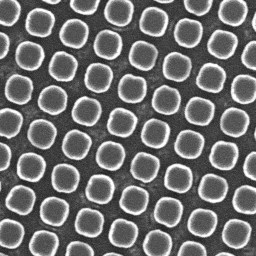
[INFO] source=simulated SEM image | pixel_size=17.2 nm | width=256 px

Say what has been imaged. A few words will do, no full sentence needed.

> a regular array of raised bodies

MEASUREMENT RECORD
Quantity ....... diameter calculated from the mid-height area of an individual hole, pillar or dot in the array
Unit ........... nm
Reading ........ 487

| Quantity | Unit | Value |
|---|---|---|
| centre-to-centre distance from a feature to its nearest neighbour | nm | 601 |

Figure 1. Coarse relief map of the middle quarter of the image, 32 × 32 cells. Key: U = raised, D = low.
UUUDDDDUUUUDDDDDDDUUUUDDDUUUUUUU
UUUDDDUUUUUUDDDDDDDDUDDDDUUUUUUU
UUUDDDUUUUUUDDDDDDDDDDDDDUUUUUUD
UUDDDUUUUUUUDDDUUUUDDDDDDDUUUUDD
DDDDDUUUUUUUDDUUUUUUDDDDDDDDDDDD
DDDDDDUUUUUDDDUUUUUUDDDDDUDDDDDD
DDDDDDDUUUUDDDUUUUUUDDDUUUUUDDDD
DDDDDDDDDDDDDDUUUUUUDDDUUUUUUDDD
UDDDUUDDDDDDDDUUUUUUDDUUUUUUUDDD
UDDUUUUUDDDDDDDDUUDDDDUUUUUUUDDU
DDDUUUUUUDDDDDDDDDDDDDUUUUUUUDDU
DDUUUUUUUDDDDUUDDDDDDDDUUUUUDDUU
DDUUUUUUUDDDUUUUUDDDDDDDDUUDDDUU
DDUUUUUUDDDUUUUUUUDDDDDDDDDDDDDU
DDDUUUUUDDDUUUUUUUDDDUUUUDDDDDDD
DDDDDDDDDDDUUUUUUUDDUUUUUUDDDDDD
DDDDDDDDDDDUUUUUUDDDUUUUUUDDDDDD
DUUUUDDDDDDDUUUUDDDUUUUUUUDDDUUU
UUUUUUDDDDDDDDDDDDDUUUUUUUDDUUUU
UUUUUUUDDDDUDDDDDDDDUUUUUUDDUUUU
UUUUUUDDDUUUUUDDDDDDDUUUUDDDUUUU
UUUUUUDDDUUUUUUDDDDDDDDDDDDDUUUU
UUUUUDDDUUUUUUUDDDDUUDDDDDDDDUUU
DDUUUDDDUUUUUUUDDDUUUUUDDDDDDDDU
DDDDDDDDUUUUUUUDDUUUUUUUDDDDDDDD
UUDDDDDDDUUUUUDDDUUUUUUUDDDUUUDD
UUUDDDDDDDDDDDDDDUUUUUUDDDUUUUUD
UUUUDDDDDDDDDDDDDUUUUUUDDUUUUUUU
UUUUDDDUUUUDDDDDDDUUUUDDDUUUUUUU
UUUUDDUUUUUUDDDDDDDDUDDDDUUUUUUU
UUUDDDUUUUUUDDDDDDDDDDDDDUUUUUUU
UUUDDDUUUUUUDDDUUUUUDDDDDDDUUUUD